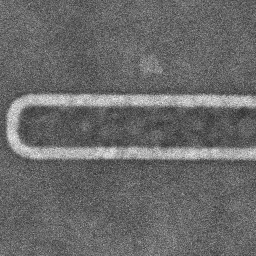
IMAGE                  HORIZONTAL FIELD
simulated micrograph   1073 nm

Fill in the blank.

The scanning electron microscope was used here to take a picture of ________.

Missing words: one or a few lines or trenches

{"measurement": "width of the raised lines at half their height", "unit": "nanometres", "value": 227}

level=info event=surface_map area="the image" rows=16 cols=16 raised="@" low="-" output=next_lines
----------------
----------------
----------------
----------------
----------------
----------------
-@@@@@@@@@@@@@@@
-@@@@@@@@@@@@@@@
-@@@@@@@@@@@@@@@
--@@@@@@@@@@@@@@
----------------
----------------
----------------
----------------
----------------
----------------